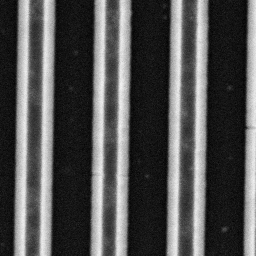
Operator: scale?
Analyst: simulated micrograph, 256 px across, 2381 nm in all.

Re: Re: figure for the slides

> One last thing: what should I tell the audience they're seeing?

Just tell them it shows one or a few lines or trenches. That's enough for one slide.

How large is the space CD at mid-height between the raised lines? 450 nanometers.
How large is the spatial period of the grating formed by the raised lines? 76.5 pixels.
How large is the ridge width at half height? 260 nm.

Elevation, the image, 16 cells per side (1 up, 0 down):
0110001100011000
0110001100011000
0110001100011000
0110001100011000
0110001100011000
0110001100011000
0110001100011000
0110001100011000
0110001100011000
0110001100011000
0110001100011000
0110001100011000
0110001100011000
0110001100011000
0110001100010000
0110001100010000